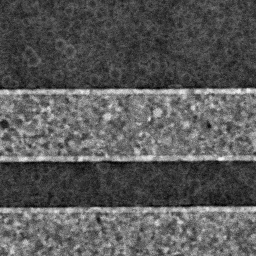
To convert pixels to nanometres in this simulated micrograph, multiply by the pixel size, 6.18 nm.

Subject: one or a few lines or trenches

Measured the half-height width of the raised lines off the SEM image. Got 0.41 micrometres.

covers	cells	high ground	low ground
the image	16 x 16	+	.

................
................
................
................
................
................
++++++++++++++++
++++++++++++++++
++++++++++++++++
++++++++++++++++
................
................
................
++++++++++++++++
++++++++++++++++
++++++++++++++++